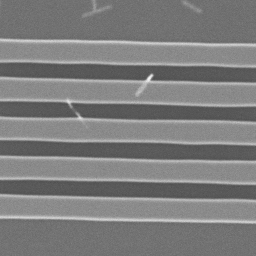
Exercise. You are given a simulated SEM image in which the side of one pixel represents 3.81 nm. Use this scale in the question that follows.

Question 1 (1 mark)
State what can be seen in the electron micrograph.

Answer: groups of lines, slits or small figures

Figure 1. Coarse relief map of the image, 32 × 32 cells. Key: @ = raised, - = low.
--------------------------------
--------------------------------
--------------------------------
--------------------------------
--------------------------------
@@@@@@@@@@@@@@@@@@@@@@@@@@------
@@@@@@@@@@@@@@@@@@@@@@@@@@@@@@@@
@@@@@@@@@@@@@@@@@@@@@@@@@@@@@@@@
--------------------------------
--------------------------------
@@@@@@@@@@@@@@@@@@@@@@@@@@@@@@@@
@@@@@@@@@@@@@@@@@@@@@@@@@@@@@@@@
@@@@@@@@@@@@@@@@@@@@@@@@@@@@@@@@
--------------------------------
--------------------------------
@@@@@@@@@@@@@@@@@@@@@@@@@@@@@@@@
@@@@@@@@@@@@@@@@@@@@@@@@@@@@@@@@
-----@@@@@@@@@@@@@@@@@@@@@@@@@@@
--------------------------------
--------------------------------
@@@@@@@@@@@@@@@@@@@@@@@@@@@@@@@@
@@@@@@@@@@@@@@@@@@@@@@@@@@@@@@@@
---------@@@@@@@@@@@@@@@@@@@@@@@
--------------------------------
@@@@----------------------------
@@@@@@@@@@@@@@@@@@@@@@@@@@@@@@@@
@@@@@@@@@@@@@@@@@@@@@@@@@@@@@@@@
------------@@@@@@@@@@@@@@@@@@@@
--------------------------------
--------------------------------
--------------------------------
--------------------------------